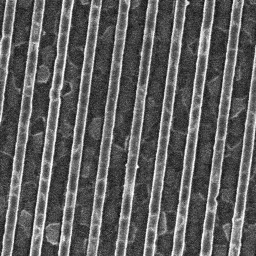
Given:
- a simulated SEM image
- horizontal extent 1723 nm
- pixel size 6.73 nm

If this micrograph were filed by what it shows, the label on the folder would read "parallel lines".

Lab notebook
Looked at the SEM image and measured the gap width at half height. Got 124 nm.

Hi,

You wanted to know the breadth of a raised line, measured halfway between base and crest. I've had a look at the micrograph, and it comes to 62.6 nanometers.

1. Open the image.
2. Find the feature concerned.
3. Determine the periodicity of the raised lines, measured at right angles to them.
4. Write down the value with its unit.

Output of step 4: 189 nanometers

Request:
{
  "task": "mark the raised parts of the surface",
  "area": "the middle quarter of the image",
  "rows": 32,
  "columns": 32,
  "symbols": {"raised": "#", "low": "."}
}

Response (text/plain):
.....##.....##.....##.....##....
.....##.....##.....##.....##....
.....##.....##.....##.....##....
....###.....##.....##.....##....
....###.....##.....##.....##....
....##.....###....###.....##....
....##.....##.....##.....###....
....##.....##.....##.....###....
....##.....##.....##.....##.....
....##.....##.....##.....##.....
....##.....##.....##.....##.....
...###....###.....##.....##.....
...###....###....###....###.....
...##.....###....###....###.....
...##.....##.....###....###....#
...##.....##.....##.....###....#
...##.....##.....##.....##.....#
...##.....##.....##.....##.....#
...##.....##.....##.....##.....#
..###.....##.....##.....##.....#
..###....###....###.....##.....#
..###....###....###.....##.....#
..##.....##.....###....###....##
..##.....##.....##.....##.....##
..##.....##.....##.....##.....##
..##.....##.....##.....##.....##
.###.....##.....##.....##.....##
.###.....##.....##.....##.....##
.###....###....###.....##.....##
.##.....##.....##.....###....###
.##.....##.....##.....###....###
.##.....##.....##.....##.....##.